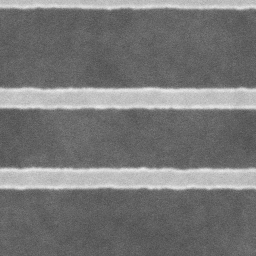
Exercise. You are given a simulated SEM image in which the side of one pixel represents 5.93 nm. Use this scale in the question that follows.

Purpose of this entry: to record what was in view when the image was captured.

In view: lines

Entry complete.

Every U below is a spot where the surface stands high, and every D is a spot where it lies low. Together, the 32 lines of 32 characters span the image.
UUUUUUUUUUUUUUUUUUUUUUUUUUUUUUUU
DDDDDDDDDDDDDDDDDDDDDDDDDDDDDDDD
DDDDDDDDDDDDDDDDDDDDDDDDDDDDDDDD
DDDDDDDDDDDDDDDDDDDDDDDDDDDDDDDD
DDDDDDDDDDDDDDDDDDDDDDDDDDDDDDDD
DDDDDDDDDDDDDDDDDDDDDDDDDDDDDDDD
DDDDDDDDDDDDDDDDDDDDDDDDDDDDDDDD
DDDDDDDDDDDDDDDDDDDDDDDDDDDDDDDD
DDDDDDDDDDDDDDDDDDDDDDDDDDDDDDDD
DDDDDDDDDDDDDDDDDDDDDDDDDDDDDDDD
DDDDDDDDDDDDDDDDDDDDDDDDDDDDDDDD
UUUUUUUUUUUUUUUUUUUUUUUUUUUUUUUU
UUUUUUUUUUUUUUUUUUUUUUUUUUUUUUUU
DDUUDUUUUUDDUUUUUDUUUUUUUUUUUUUU
DDDDDDDDDDDDDDDDDDDDDDDDDDDDDDDD
DDDDDDDDDDDDDDDDDDDDDDDDDDDDDDDD
DDDDDDDDDDDDDDDDDDDDDDDDDDDDDDDD
DDDDDDDDDDDDDDDDDDDDDDDDDDDDDDDD
DDDDDDDDDDDDDDDDDDDDDDDDDDDDDDDD
DDDDDDDDDDDDDDDDDDDDDDDDDDDDDDDD
DDDDDDDDDDDDDDDDDDDDDDDDDDDDDDDD
UUUUUUUUUUUUUUUUUUUUUUUUUUUUUUUU
UUUUUUUUUUUUUUUUUUUUUUUUUUUUUUUU
DDUUDDUUDUDDDDDDDDDUDUUDDDUDDUUU
DDDDDDDDDDDDDDDDDDDDDDDDDDDDDDDD
DDDDDDDDDDDDDDDDDDDDDDDDDDDDDDDD
DDDDDDDDDDDDDDDDDDDDDDDDDDDDDDDD
DDDDDDDDDDDDDDDDDDDDDDDDDDDDDDDD
DDDDDDDDDDDDDDDDDDDDDDDDDDDDDDDD
DDDDDDDDDDDDDDDDDDDDDDDDDDDDDDDD
DDDDDDDDDDDDDDDDDDDDDDDDDDDDDDDD
DDDDDDDDDDDDDDDDDDDDDDDDDDDDDDDD